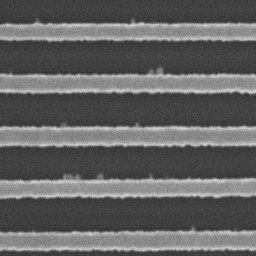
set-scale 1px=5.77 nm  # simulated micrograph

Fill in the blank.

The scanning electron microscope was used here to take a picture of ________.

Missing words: lines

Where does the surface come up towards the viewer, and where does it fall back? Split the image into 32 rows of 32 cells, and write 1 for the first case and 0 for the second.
00000000000000000000000000000000
00000000000000000000000000000000
00000000000000000000000000000000
11111111111111111111111111111111
11111111111111111111111111111111
00000000000000000000000000000000
00000000000000000000000000000000
00000000000000000000000000000000
00000000000000000000000000000000
11111111111111111111111111111111
11111111111111111111111111111111
00101100000000000000000000100001
00000000000000000000000000000000
00000000000000000000000000000000
00000000000000000000000000000000
00000000000000000000000000000000
11111111111111111111111111111111
11111111111111111111111111111111
00000000000000000000000000000000
00000000000000000000000000000000
00000000000000000000000000000000
00000000000000000000000000000000
00000000100001111111111111111111
11111111111111111111111111111111
11111110001110110100000000000000
00000000000000000000000000000000
00000000000000000000000000000000
00000000000000000000000000000000
00000000000000000000000000000000
11111111111111111111111111111111
11111111111111111111111111111111
00000000000000000000000000000000